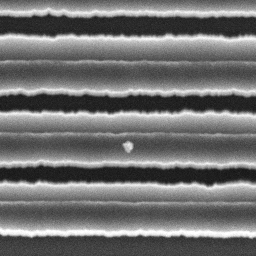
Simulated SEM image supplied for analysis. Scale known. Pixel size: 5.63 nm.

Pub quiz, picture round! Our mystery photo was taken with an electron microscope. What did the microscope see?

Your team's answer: lines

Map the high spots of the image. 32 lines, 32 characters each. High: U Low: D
UUUUUUUUUUUUUUUUUUUUUUUUUUUUUUUU
UUUUUUUUUUUUUUUUUUUUUUUUUUUUUUUU
DDDDDDDDDDDDDDDDDDDDDDDDDDDDDDDD
DDDDDDDDDDDDDDDDDDDDDDDDDDDDDDDD
DUDDDDDDDDDDDDDDDDDDDDDDDDDDDDDD
UUUUUUUUUUUUUUUUUUUUUUUUUUUUUUUU
UUUUUUUUUUUUUUUUUUUUUUUUUUUUUUUU
UUUUUUUUUUUUUUUUUUUUUUUUUUUUUUUU
UUUUUUUUUUUUUUUUUUUUUUUUUUUUUUUU
UUUUUUUUUUUUUUUUUUUUUUUUUUUUUUUU
UUUUUUUUUUUUUUUUUUUUUUUUUUUUUUUU
UDDUDDDDDUDDUUUUDDUDUUUUDUDDDDUU
DDDDDDDDDDDDDDDDDDDDDDDDDDDDDDDD
DDDDDDDDDDDDDDDDDDDDDDDDDDDDDDDD
UUUUUUUUUUUUUUUUUUUUUUUUUUUUUUUU
UUUUUUUUUUUUUUUUUUUUUUUUUUUUUUUU
UUUUUUUUUUUUUUUUUUUUUUUUUUUUUUUU
UUUUUUUUUUUUUUUUUUUUUUUUUUUUUUUU
UUUUUUUUUUUUUUUUUUUUUUUUUUUUUUUU
UUUUUUUUUUUUUUUUUUUUUUUUUUUUUUUU
UUUDDDDDDDUUUDUUUUUUUUUUUUUUUUUU
DDDDDDDDDDDDDDDDDDDDDDDDDDDDDDDD
DDDDDDDDDDDDDDDDDDDDDDDDDDDDDDDD
UUUUUUUUUUUUUUUUUUUUUUUUUUUUUUUU
UUUUUUUUUUUUUUUUUUUUUUUUUUUUUUUU
UUUUUUUUUUUUUUUUUUUUUUUUUUUUUUUU
UUUUUUUUUUUUUUUUUUUUUUUUUUUUUUUU
UUUUUUUUUUUUUUUUUUUUUUUUUUUUUUUU
UUUUUUUUUUUUUUUUUUUUUUUUUUUUUUUU
DDDDDDDDDDDDDDDDDDDDDDDDDDDDDDDD
DDDDDDDDDDDDDDDDDDDDDDDDDDDDDDDD
DDDDDDDDDDDDDDDDDDDDDDDDDDDDDDDD